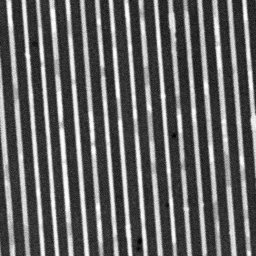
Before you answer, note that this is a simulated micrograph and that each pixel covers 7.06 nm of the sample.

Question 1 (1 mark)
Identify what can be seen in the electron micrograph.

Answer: parallel lines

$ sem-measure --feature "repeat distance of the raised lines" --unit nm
104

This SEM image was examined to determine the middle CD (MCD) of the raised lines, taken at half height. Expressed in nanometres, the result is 24.6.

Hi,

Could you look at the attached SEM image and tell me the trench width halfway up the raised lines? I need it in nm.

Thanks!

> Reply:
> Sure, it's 80.9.